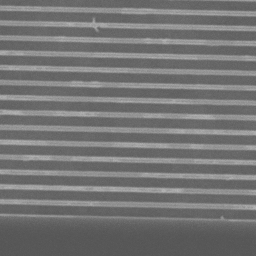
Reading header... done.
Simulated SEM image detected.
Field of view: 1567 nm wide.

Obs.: parallel lines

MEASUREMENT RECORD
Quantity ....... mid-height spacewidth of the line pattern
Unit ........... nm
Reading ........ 66.5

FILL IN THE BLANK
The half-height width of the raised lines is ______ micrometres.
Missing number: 0.0245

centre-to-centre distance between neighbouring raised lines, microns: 0.0911